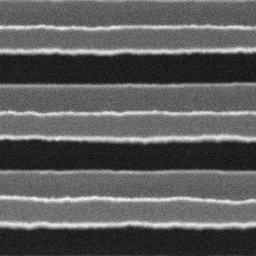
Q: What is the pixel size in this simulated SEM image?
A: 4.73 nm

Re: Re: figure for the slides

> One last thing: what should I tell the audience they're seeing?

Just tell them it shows lines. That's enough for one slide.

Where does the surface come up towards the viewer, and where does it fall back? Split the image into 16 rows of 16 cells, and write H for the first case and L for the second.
HHHHHHHHHHHHHHHH
HHHHHHHHHHHHHHHH
HHHHHHHHHHHHHHHH
LLLLLLLLLLLLLLLL
LLLLLLLLLLLLLLLL
HHHHHHHHHHHHHHHH
HHHHHHHHHHHHHHHH
HHHHHHHHHHHHHHHH
HHHHHHHHHHHHHHHH
LLLLLLLLLLLLLLLL
LLLLLLLLLLLLLLLL
HHHHHHHHHHHHHHHH
HHHHHHHHHHHHHHHH
HHHHHHHHHHHHHHHH
LLLLLLLLLLLLLLLL
LLLLLLLLLLLLLLLL